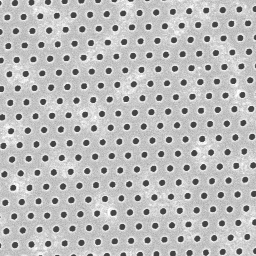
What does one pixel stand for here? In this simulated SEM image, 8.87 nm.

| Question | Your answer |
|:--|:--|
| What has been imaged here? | a regular array of holes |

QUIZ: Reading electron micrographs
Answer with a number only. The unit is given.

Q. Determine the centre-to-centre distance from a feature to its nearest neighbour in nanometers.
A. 143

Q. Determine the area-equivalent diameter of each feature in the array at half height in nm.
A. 55.7